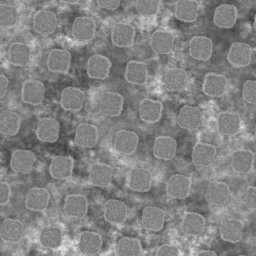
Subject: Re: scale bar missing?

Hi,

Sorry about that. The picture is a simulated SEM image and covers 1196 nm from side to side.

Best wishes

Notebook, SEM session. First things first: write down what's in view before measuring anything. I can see a regular array of raised bodies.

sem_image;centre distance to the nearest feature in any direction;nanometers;182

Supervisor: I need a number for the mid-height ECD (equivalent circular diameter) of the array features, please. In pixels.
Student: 24.3